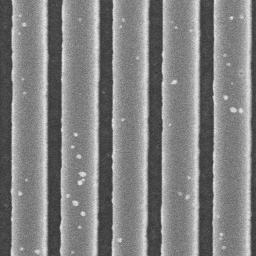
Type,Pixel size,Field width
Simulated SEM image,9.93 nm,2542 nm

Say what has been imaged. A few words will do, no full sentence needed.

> lines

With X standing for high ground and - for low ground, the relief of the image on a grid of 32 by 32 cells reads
--XXXX--XXXX--XXXXX-XXXXX--XXXX-
--XXXX--XXXX--XXXXX-XXXXX--XXXX-
--XXXX--XXXX--XXXXX-XXXXX--XXXX-
--XXXX--XXXX--XXXXX-XXXXX--XXXX-
--XXXX--XXXX--XXXXX-XXXXX--XXXX-
--XXXX--XXXX--XXXXX-XXXXX--XXXX-
--XXXX--XXXX--XXXXX-XXXXX--XXXX-
--XXXX--XXXX--XXXXX-XXXXX--XXXX-
--XXXX--XXXX--XXXXX-XXXXX--XXXX-
--XXXX--XXXX--XXXXX-XXXXX--XXXX-
--XXXX--XXXX--XXXX--XXXXX--XXXX-
--XXXX--XXXX--XXXX--XXXXX--XXXX-
--XXXX--XXXX--XXXX--XXXXX--XXXX-
--XXXX--XXXX--XXXX--XXXXX--XXXX-
--XXXX--XXXX--XXXX--XXXXX--XXXX-
--XXXX--XXXX--XXXX--XXXXX--XXXX-
--XXXX--XXXX--XXXX--XXXXX--XXXX-
--XXXX--XXXX--XXXX--XXXXX--XXXX-
--XXXX--XXXX--XXXX--XXXXX--XXXX-
--XXXX--XXXX--XXXX--XXXXX--XXXX-
--XXXX--XXXX--XXXX--XXXXX--XXXX-
--XXXX--XXXX--XXXX--XXXXX--XXXX-
--XXXX--XXXX--XXXX--XXXXX--XXXX-
-XXXXX--XXXX--XXXX--XXXXX--XXXX-
-XXXXX--XXXX--XXXX--XXXXX--XXXX-
--XXXX--XXXX--XXXX--XXXXX--XXXX-
--XXXX--XXXX--XXXX--XXXXX--XXXX-
-XXXXX--XXXX--XXXX--XXXXX--XXXX-
--XXXX--XXXX--XXXX--XXXXX--XXXX-
--XXXX--XXXX--XXXX--XXXXX--XXXX-
-XXXXX--XXXX--XXXX--XXXXX--XXXX-
-XXXXX--XXXX--XXXX--XXXXX--XXXX-